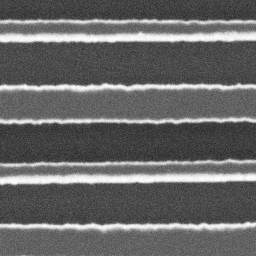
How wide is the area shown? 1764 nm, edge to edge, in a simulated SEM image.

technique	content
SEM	lines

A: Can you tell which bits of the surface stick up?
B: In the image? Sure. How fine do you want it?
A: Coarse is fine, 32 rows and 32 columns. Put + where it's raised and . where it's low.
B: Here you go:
................................
................................
................................
++++++++++++++++++++++++++++++++
++++++++++++++++++++++++++++++++
................................
................................
................................
................................
................................
................................
++++++++++++++++++++++++++++++++
++++++++++++++++++++++++++++++++
++++++++++++++++++++++++++++++++
++++++++++++++++++++++++++++++++
................................
................................
................................
................................
................................
....++++++++++++++++++++++++++++
++++++++++++++++++++++++++++++++
+++++++++++++++++++++...........
................................
................................
................................
................................
................................
++++++++++++++++++++++++++++++++
++++++++++++++++++++++++++++++++
++++++++++++++++++++++++++++++++
++++++++++++++++++++++++++++++++